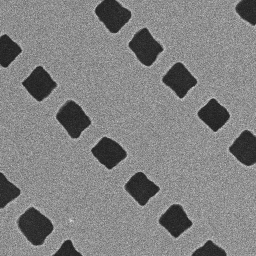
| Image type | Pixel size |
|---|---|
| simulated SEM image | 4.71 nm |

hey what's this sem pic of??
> a regular array of holes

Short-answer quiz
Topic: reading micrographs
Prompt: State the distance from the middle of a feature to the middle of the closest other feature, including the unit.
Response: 228 nanometres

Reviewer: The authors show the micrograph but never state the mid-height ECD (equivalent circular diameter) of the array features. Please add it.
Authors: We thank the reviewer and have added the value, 139 nm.